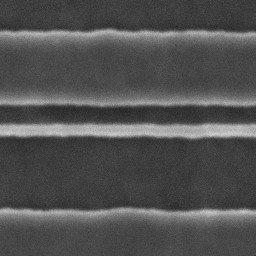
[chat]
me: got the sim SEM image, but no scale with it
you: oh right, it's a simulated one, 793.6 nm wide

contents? lines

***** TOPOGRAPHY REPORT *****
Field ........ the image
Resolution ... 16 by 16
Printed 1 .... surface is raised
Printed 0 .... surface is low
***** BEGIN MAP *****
0000000000000000
0000000000000000
1111111111111111
1111111111111111
1111111111111111
1111111111111111
1111111111111111
1111111111111111
0000000000011000
0000000000000000
0000000000000000
0000000000000000
0000000000000000
1111111111111111
1111111111111111
1111111111111111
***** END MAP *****